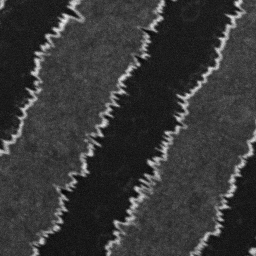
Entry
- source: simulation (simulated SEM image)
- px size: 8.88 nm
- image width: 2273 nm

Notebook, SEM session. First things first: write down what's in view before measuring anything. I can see one or a few lines or trenches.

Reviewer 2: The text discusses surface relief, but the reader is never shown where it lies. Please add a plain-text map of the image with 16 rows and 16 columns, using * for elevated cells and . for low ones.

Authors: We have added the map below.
.....*****.....*
....******....**
...******.....**
...******.....**
..******.....***
..*****.....****
..*****.....****
.*****.....*****
.*****.....*****
******....******
*****.....*****.
****.....******.
****.....*****..
****....******..
***....******...
**.....*****....